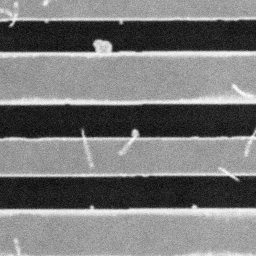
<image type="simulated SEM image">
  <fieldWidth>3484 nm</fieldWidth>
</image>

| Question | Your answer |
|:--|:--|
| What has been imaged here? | lines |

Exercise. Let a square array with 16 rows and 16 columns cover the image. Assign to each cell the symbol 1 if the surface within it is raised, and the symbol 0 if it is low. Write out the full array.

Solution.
1111111111111111
0000000000000000
0000000000000000
1111111111111111
1111111111111111
1111111111111111
0000000000000000
0000000000000000
0000000000000000
1111111111111111
1111111111111111
0000000000000000
0000000000000000
1111111111111111
1111111111111111
1111111111111111